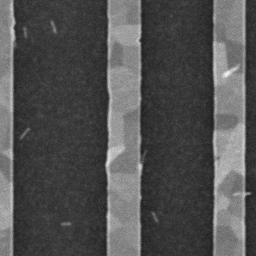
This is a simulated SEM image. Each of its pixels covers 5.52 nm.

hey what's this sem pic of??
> one or a few lines or trenches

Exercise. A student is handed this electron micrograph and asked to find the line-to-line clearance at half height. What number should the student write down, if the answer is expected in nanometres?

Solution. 472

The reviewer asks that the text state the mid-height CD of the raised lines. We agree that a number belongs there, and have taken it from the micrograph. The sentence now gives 170 nm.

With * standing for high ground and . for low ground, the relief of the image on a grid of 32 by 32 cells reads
*.............***..........****.
**............***..........****.
**............****.........***..
**............****.........***..
**............****.........****.
**............***..........****.
**............****.........****.
**............****.........****.
*.............****.........****.
**............***..........***..
*.............***..........***..
*.............***..........****.
*.............***..........****.
**............***..........****.
**............***..........****.
**............***..........****.
*.............***..........****.
*.............***..........****.
*.............***..........***..
*.............***..........***..
**...........****..........***..
*............****..........***..
*.............***..........****.
*.............***..........****.
*.............***..........****.
*.............***..........***..
*.............***..........***..
*.............***..........***..
*.............***..........****.
*............****..........****.
*.............***..........****.
*.............***..........****.